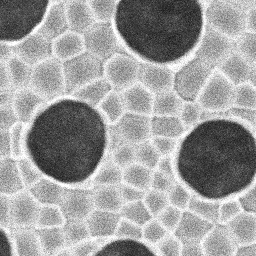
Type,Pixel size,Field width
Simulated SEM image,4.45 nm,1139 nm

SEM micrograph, holes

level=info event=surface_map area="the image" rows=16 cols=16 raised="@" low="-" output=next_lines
---@@@@------@@@
--@@@@@------@@@
-@@@@@@@----@@@@
@@@@@@@@@--@@@@@
@@@@@@@@@@@@@@@@
@@@@@@@@@@@@@@@@
@@@--@@@@@@@@@@@
@@----@@@@@@@-@@
@@-----@@@@@----
@@-----@@@@-----
@@----@@@@@-----
@@@@@@@@@@@@----
@@@@@@@@@@@@@@@@
@@@@@@@@@@@@@@@@
@@@@@@@@@@@@@@@@
-@@@@@---@@@@@@@